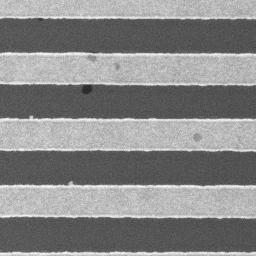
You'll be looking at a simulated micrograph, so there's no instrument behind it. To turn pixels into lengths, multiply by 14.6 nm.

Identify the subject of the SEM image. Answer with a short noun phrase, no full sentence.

lines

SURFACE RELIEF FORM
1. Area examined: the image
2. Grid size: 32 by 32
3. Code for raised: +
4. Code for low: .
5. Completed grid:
++++++++++++++++++++++++++++++++
++++++++++++++++++++++++++++++++
................................
................................
................................
................................
................................
++++++++++++++++++++++++++++++++
++++++++++++++++++++++++++++++++
++++++++++++++++++++++++++++++++
.............+++++++++++++++++++
................................
................................
................................
................................
++++++++++++++++++++++++++++++++
++++++++++++++++++++++++++++++++
++++++++++++++++++++++++++++++++
++++++++++++++++++++++++++++++++
................................
................................
................................
................................
++++++++++++++++++++++++++++++++
++++++++++++++++++++++++++++++++
++++++++++++++++++++++++++++++++
++++++++++++++++++++++++++++++++
................................
................................
................................
................................
................................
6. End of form